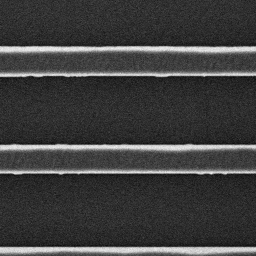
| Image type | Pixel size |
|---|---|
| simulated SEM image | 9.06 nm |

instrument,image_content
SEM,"lines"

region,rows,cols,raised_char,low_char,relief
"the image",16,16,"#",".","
................
................
................
################
################
................
................
................
................
################
################
................
................
................
................
................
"